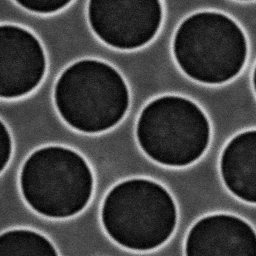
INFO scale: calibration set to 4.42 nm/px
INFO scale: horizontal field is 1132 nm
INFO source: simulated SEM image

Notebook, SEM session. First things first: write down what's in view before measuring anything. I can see holes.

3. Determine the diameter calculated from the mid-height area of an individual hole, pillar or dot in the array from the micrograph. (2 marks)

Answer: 0.328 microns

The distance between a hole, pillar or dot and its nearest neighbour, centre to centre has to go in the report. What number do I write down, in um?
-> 0.394